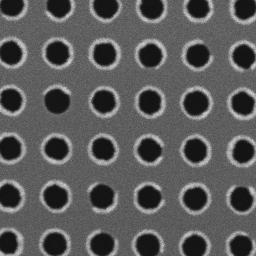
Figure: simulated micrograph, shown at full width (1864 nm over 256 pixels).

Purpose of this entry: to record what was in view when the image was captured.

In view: a regular array of holes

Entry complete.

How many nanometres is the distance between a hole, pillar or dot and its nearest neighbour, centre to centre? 336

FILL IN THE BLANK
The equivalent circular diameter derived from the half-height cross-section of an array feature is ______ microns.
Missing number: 0.173